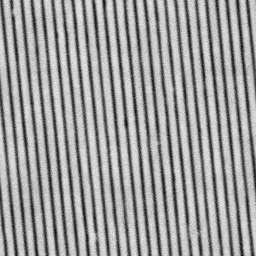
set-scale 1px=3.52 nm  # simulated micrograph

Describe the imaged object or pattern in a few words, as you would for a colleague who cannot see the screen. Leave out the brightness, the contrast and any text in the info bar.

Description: parallel lines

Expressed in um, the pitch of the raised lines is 0.0359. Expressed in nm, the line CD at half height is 24.9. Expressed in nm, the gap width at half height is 9.2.